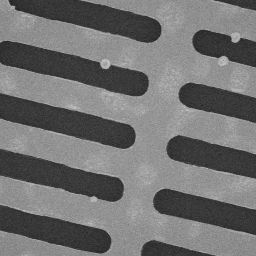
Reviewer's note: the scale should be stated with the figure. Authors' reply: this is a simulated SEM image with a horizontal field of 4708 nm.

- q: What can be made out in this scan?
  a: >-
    holes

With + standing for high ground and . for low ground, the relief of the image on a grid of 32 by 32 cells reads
+...........++++++++++++++++....
+++.............++++++++++++++++
+++++++............+++++++++++++
+++++++++++.........++++++++++++
+++++++++++++++.....++++.....+++
...+++++++++++++++++++++........
.......++++++++++++++++++.......
...........++++++++++++++++++...
++..............++++++++++++++++
+++++++...........++++++++++++++
++++++++++.........++++..+++++++
++++++++++++++....++++.......+++
....++++++++++++++++++..........
........++++++++++++++++........
............++++++++++++++++....
++..............++++++++++++++++
+++++++..........+++++++++++++++
++++++++++.......++++....+++++++
+++++++++++++++.+++++........+++
....+++++++++++++++++...........
........+++++++++++++++.........
............++++++++++++++++....
++.............+++++++++++++++++
+++++++........+++++++++++++++++
+++++++++++....++++......+++++++
+++++++++++++++++++..........+++
...+++++++++++++++++............
........++++++++++++++++........
............++++++++++++++++....
+++...........++++++++++++++++++
+++++++.......++++...+++++++++++
+++++++++++..+++++.......+++++++